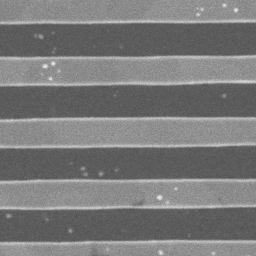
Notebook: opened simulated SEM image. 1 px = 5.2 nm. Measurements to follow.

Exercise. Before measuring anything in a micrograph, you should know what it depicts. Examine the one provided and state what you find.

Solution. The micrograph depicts wiring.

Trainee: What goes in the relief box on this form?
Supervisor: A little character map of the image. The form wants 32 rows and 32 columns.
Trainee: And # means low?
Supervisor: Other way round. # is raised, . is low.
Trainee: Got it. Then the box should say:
################################
################################
################################
................................
................................
................................
................................
################################
################################
################################
##############....####..........
................................
................................
................................
................................
################################
################################
################################
................................
................................
................................
................................
......................########.#
################################
################################
################################
................................
................................
................................
................................
################################
################################